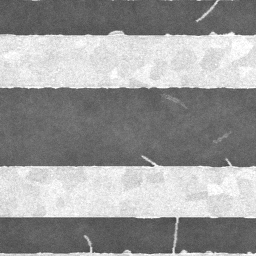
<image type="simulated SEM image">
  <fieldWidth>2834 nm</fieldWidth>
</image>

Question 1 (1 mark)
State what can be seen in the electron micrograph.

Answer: lines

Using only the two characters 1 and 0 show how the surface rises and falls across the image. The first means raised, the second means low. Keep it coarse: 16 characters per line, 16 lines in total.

0000000000000000
0000000000000000
1111111111111111
1111111111111111
1111111111111111
0000000000000000
0000000000000000
0000000000000000
0000000000000000
0000000000000000
1111111111111111
1111111111111111
1111111111111111
1111111111111111
0000000000000000
0000000000000000